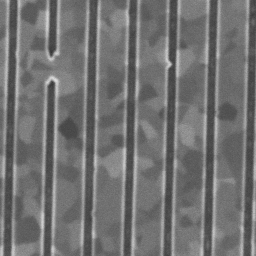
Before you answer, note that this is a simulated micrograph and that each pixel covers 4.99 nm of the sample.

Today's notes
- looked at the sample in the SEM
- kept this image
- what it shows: parallel lines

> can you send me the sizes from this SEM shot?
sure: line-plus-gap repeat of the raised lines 0.2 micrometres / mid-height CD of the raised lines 150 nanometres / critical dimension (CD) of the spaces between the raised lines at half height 49.9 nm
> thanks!